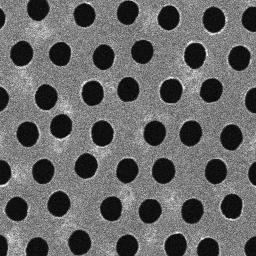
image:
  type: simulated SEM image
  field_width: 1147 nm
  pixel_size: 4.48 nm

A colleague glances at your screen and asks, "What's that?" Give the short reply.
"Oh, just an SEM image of a regular array of holes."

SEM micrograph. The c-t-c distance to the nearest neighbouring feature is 170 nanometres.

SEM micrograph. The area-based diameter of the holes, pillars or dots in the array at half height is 105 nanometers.